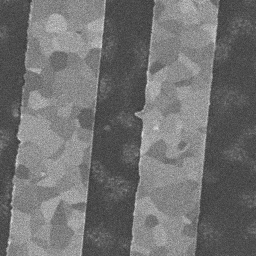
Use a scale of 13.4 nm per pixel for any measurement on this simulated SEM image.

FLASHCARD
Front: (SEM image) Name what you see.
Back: one or a few lines or trenches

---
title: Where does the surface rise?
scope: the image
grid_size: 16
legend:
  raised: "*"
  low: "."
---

..*****...****..
..****....****..
..****...****...
..****...****...
..****...****...
.*****...****...
.*****...****...
.*****...****...
.*****...****...
.*****...****...
.*****...****...
.****....****...
.****...****....
.****...****....
.****...****....
*****...****....